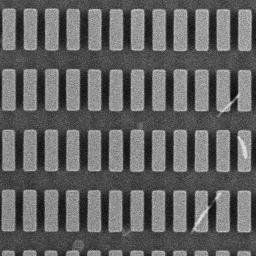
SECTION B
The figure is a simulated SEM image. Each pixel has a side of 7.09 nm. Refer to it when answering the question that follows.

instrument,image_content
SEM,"groups of lines, slits or small figures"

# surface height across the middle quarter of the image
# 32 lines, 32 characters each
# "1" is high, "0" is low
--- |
00000000000000000000000000000000
00000000000000000000000000000000
01110011100011000111001110001110
01110011100111000111001110001110
01110011100111100111001110001110
01110011100111100111001110001110
01110011100111100111001110001110
01110011100111100111001110001110
01110011100111100111001110001110
01110011100111100111001110001110
01110011100111100111001110001110
01100011100011000111000110001100
00000000000000000000000000000000
00000000000000000000000000000000
00000000000000000000000000000000
00000000000000000000000000000000
00000000000000000000000000000000
01110011100111100111001110001110
01110011100111100111001110001110
01110011100111100111001110001110
01110011100111100111001110001110
01110011100111100111001110001110
01110011100111100111001110001110
01110011100111100111001110001110
01110011100111100111001110001110
01110011100111100111001110001110
01110011100011000111001110001110
00000000000000000000000000000000
00000000000000000000000000000000
00000000000000000000000000000000
00000000000000000000000000000000
00000000000000000000000000000000